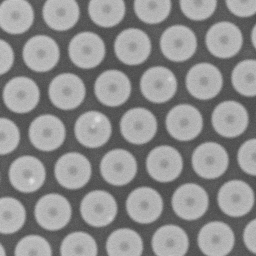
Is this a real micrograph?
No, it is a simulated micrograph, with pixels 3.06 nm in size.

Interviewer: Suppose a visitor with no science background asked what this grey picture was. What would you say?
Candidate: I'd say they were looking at an array of small figures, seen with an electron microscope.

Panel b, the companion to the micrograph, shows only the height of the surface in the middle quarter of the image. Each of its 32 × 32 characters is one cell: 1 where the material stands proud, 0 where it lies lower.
00011111000000000000000000000000
00000000000000000000011111000001
01000000011111100000111111100001
11110000111111110001111111110001
11111000111111110001111111110001
11111000111111111001111111110001
11111000111111111001111111110001
11111000111111110000111111100000
11111000111111110000011111100000
11110000011111100000001110000000
11100000000010000000000000001111
00000000000000001111100000011111
00000111100000011111110000111111
00001111111000011111111000111111
00011111111000111111111000111111
00011111111100111111111000111111
00011111111100111111111000111111
00011111111100011111111000011111
00011111111000011111110000001111
00001111111000000111100000000000
00000111100000000000000000000000
00000000000011100000001111110000
01110000000111111000011111111000
11111000001111111100011111111000
11111100011111111100011111111100
11111110011111111100011111111000
11111110011111111100011111111000
11111110011111111100011111111000
11111100001111111000001111110000
11111100000111110000000000000000
11111000000000000000000000000111
00000000000000000011110000001111